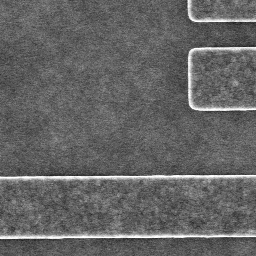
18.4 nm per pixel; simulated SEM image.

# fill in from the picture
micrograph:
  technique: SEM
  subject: wiring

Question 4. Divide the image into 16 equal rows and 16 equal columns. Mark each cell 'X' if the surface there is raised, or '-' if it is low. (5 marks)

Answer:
------------XXXX
----------------
----------------
------------XXXX
------------XXXX
------------XXXX
------------XXXX
----------------
----------------
----------------
----------------
XXXXXXXXXXXXXXXX
XXXXXXXXXXXXXXXX
XXXXXXXXXXXXXXXX
XXXXXXXXXXXXXXXX
----------------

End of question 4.